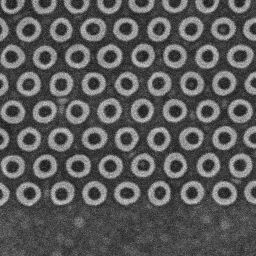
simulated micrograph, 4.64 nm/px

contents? a regular array of ring-shaped raised bodies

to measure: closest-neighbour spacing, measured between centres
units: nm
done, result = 143